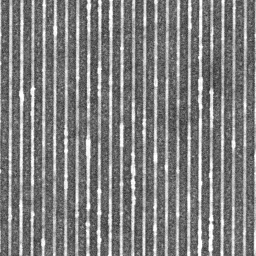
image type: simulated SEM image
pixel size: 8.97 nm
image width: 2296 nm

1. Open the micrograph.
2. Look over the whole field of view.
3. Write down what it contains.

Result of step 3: parallel lines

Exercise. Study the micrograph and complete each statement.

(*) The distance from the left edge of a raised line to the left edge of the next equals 100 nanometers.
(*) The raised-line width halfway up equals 15.7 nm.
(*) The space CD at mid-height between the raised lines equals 0.0785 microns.